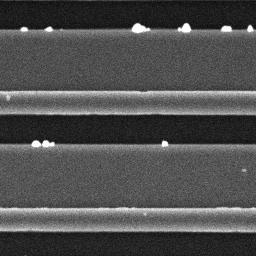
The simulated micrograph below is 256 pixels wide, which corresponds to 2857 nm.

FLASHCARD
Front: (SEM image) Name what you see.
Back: lines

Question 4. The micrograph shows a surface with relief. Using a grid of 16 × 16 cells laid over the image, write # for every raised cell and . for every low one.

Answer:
................
................
################
################
################
################
################
................
................
################
################
################
################
################
................
................